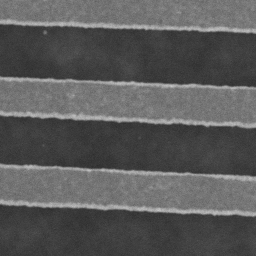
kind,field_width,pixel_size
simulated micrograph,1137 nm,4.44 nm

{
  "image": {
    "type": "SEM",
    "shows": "lines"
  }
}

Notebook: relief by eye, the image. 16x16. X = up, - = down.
XXXXXXXXXXXXXXXX
-XXXXXXXXXXXXXXX
----------------
----------------
----------------
XXXXXXXXXXXXXXXX
XXXXXXXXXXXXXXXX
-------XXXXXXXXX
----------------
----------------
XXXXX-----------
XXXXXXXXXXXXXXXX
XXXXXXXXXXXXXXXX
----------------
----------------
----------------